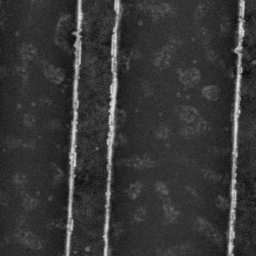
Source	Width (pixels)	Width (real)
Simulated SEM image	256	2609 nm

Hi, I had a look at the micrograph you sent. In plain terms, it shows one or a few lines or trenches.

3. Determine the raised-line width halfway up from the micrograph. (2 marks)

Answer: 398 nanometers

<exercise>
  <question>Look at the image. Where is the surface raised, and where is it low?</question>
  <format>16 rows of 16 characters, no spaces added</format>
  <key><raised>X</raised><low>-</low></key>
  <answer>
-----XX--------X
-----XX--------X
-----XX--------X
-----XX--------X
-----XX--------X
-----XX--------X
-----XX--------X
-----XX--------X
-----XX--------X
----XXX--------X
----XXX--------X
----XXX--------X
----XXX--------X
----XXX-------XX
----XXX-------XX
----XXX-------XX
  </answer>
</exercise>